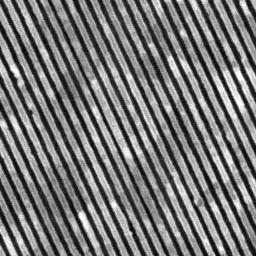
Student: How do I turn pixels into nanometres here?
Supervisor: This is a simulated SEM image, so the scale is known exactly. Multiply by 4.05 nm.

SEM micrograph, parallel lines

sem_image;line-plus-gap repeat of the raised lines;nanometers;45.4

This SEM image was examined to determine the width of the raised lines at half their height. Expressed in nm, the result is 21.2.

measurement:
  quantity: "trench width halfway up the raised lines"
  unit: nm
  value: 24.8